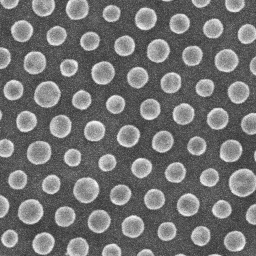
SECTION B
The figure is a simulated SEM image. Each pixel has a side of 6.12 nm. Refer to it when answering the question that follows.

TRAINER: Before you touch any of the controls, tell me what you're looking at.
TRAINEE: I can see a regular array of raised bodies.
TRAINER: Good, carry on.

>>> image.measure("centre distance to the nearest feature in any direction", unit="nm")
207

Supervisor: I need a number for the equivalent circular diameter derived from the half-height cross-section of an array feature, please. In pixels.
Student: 19.7